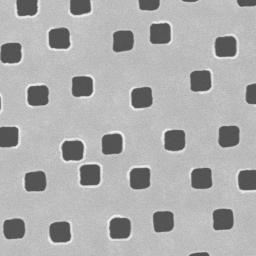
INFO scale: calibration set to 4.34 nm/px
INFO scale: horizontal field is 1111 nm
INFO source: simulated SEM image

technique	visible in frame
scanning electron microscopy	a regular array of holes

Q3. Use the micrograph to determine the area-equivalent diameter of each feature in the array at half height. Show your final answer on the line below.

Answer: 96.9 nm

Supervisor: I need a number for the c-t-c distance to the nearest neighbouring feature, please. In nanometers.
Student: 196